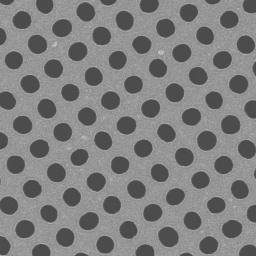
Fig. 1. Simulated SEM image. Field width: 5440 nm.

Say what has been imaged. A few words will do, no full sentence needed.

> a regular array of holes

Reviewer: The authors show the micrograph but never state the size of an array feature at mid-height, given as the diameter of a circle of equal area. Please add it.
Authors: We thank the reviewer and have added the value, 394 nm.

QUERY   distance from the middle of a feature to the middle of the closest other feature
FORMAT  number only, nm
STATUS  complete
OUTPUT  600